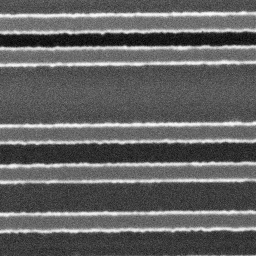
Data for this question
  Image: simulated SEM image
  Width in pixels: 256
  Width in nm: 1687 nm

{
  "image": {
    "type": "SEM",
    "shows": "lines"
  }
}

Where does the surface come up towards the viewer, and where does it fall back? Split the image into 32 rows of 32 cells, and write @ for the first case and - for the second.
--------------------------------
--------------------------------
@@@@@@@@@@@@@@@@@@@@@@@@@@@@@@@@
@@@@@@@@@@@@@@@@@@@@@@@@@@@@@@@@
--------------------------------
--------------------------------
@@@@@@@@@@@@@@@@@@@@@@@@@@@@@@@@
@@@@@@@@@@@@@@@@@@@@@@@@@@@@@@@@
--------------------------------
--------------------------------
--------------------------------
--------------------------------
--------------------------------
--------------------------------
--------------------------------
-------------@@-@@@@@@@@@@@@@@@@
@@@@@@@@@@@@@@@@@@@@@@@@@@@@@@@@
@@@@@@@@@@@@@@@@@@@@@@@@@@@@@@@@
--------------------------------
--------------------------------
----------@----@@@@@@@@@@@@@@@@@
@@@@@@@@@@@@@@@@@@@@@@@@@@@@@@@@
@@@@@@@@@@@@@@@@@@@@@@@@@@@@@@@-
--------------------------------
--------------------------------
--------------------------------
----------------------------@@-@
@@@@@@@@@@@@@@@@@@@@@@@@@@@@@@@@
@@@@@@@@@@@@@@@@@@@@@@@@@@@@@@@@
--------------------------------
--------------------------------
--------------------------------